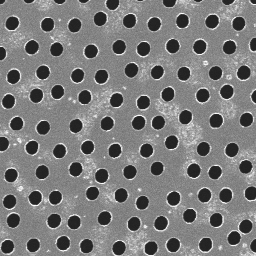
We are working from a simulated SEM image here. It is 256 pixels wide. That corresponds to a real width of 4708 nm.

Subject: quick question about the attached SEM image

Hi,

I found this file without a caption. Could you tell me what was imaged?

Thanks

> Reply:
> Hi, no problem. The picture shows a regular array of holes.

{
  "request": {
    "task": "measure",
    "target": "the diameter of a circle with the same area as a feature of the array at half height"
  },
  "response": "13.7 px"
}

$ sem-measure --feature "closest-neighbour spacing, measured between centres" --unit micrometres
0.445